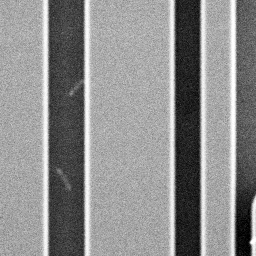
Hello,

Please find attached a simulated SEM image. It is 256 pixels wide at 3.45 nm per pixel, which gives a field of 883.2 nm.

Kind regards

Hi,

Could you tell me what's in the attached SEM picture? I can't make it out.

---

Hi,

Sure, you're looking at groups of lines, slits or small figures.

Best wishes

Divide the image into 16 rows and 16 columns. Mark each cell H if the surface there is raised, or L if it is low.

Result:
HHHLLHHHHHHLLHHL
HHHLLHHHHHHLLHHL
HHHLLHHHHHHLLHHL
HHHLLHHHHHHLLHHL
HHHLLHHHHHHLLHHL
HHHLLHHHHHHLLHHL
HHHLLHHHHHHLLHHL
HHHLLHHHHHHLLHHL
HHHLLHHHHHHLLHHL
HHHLLHHHHHHLLHHL
HHHLLHHHHHHLLHHL
HHHLLHHHHHHLLHHL
HHHLLHHHHHHLLHHL
HHHLLHHHHHHLLHHL
HHHLLHHHHHHLLHHL
HHHLLHHHHHHLLHHL